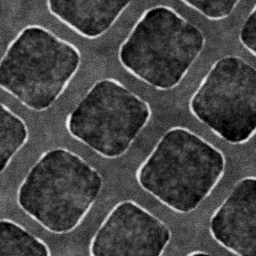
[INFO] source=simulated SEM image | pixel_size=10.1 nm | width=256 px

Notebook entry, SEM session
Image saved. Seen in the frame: holes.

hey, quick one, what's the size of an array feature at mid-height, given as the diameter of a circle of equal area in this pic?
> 766 nm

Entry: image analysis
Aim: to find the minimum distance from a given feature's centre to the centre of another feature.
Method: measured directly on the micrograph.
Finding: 881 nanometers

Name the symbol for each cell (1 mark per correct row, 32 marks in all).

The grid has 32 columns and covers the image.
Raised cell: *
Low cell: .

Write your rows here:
******..........********.....***
*******........***....***....***
********......****.....********.
***..****....****.......******..
**.....****.****.........*****..
*........******..........******.
*.........*****..........*******
..........*****.........****..**
..........******.......****.....
.........********......***......
........****...****...***.......
*.......***.....*********.......
***....***........******........
.***..****.........*****........
..*******.........*******.......
...******.........********......
...******........****...***.....
...*******.......***.....***...*
..**********....****.......*****
.*****...****.*****.........****
.****......*******..........****
****........*****...........****
***..........****..........***..
***..........*****........***...
**..........*******.......***...
***........****..****....***....
***........***....*********.....
*****.....***.......*******.....
...***...****........*****......
....********.........******.....
.....*******.........*******....
......*****.........*********...